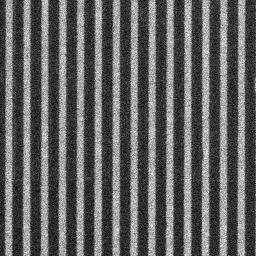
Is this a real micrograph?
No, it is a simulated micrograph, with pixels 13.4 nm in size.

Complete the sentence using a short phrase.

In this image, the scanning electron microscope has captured parallel lines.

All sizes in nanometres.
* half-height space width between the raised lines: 33.4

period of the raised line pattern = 119 nm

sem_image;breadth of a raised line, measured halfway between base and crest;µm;0.0851